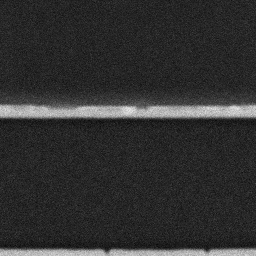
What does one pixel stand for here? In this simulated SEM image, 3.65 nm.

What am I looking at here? one or a few lines or trenches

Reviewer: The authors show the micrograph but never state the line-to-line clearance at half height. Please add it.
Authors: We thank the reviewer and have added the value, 509 nanometers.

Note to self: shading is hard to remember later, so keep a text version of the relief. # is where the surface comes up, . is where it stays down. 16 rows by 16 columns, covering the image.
################
################
################
################
################
################
################
................
................
................
................
................
................
................
................
................